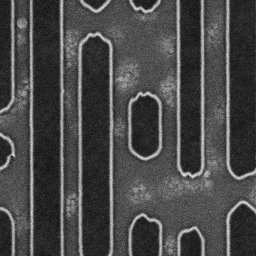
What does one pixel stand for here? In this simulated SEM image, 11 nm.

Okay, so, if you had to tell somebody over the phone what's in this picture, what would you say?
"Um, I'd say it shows parallel lines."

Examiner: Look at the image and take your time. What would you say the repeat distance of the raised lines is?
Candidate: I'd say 529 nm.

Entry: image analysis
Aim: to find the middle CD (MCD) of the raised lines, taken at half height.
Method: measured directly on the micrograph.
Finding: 336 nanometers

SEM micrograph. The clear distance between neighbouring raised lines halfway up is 0.205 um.